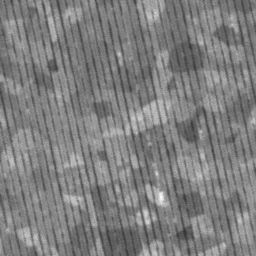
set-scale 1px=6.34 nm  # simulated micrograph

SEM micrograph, parallel lines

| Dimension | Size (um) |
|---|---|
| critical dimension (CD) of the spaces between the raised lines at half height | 0.0124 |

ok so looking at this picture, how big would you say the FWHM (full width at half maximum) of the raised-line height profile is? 37.2 nanometres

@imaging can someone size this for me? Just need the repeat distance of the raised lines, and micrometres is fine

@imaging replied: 0.0475